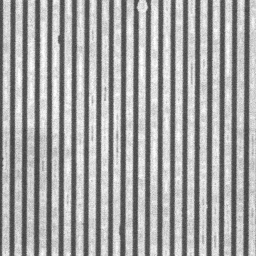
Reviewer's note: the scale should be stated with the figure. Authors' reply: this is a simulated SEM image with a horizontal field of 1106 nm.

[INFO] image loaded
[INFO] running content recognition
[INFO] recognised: parallel lines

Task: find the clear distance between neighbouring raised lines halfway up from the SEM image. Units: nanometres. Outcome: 23.8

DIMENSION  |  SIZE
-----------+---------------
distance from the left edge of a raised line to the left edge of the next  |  0.0532 um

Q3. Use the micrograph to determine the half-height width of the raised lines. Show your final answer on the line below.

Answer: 28.1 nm